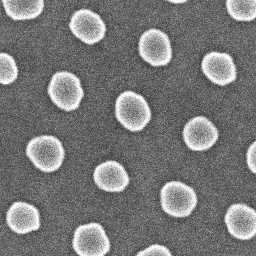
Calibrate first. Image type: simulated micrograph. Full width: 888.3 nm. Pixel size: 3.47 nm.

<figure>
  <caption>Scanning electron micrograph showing a regular array of raised bodies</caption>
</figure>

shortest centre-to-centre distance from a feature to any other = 235 nm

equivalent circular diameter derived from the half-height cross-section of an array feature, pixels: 32.5